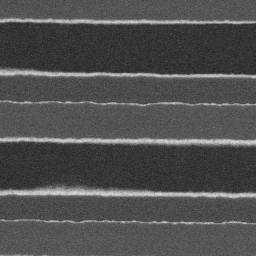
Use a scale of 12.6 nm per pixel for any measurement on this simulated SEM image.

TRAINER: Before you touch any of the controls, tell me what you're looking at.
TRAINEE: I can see lines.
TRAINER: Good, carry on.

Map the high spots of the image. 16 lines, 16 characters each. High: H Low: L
HHHHHHHHHHHHHHHH
LLLLLLLLLLLLLLLL
LLLLLLLLLLLLLLLL
LLLLLLLLLLLLLLLL
LLLLLLLLLLLLLLLL
HHHHHHHHHHHHHHHH
HHHHHHHHHHHHHHHH
HHHHHHHHHHHHHHHH
HHHHHHHHHHHHHHHH
LLLLLLLLLLLLLLLL
LLLLLLLLLLLLLLLL
LLLLLLLLLLLLLLLL
HHHHHHHHHHHHHHHH
HHHHHHHHHHHHHHHH
HHHHHHHHHHHHHHHH
HHHHHHHHHHHHHHHH